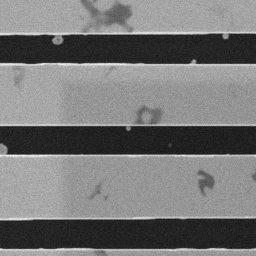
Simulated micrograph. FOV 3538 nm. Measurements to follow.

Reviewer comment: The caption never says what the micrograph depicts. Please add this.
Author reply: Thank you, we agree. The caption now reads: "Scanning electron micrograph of lines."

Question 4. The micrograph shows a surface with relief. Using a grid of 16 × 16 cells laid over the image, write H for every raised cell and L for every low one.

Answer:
HHHHHHHHHHHHHHHH
HHHHHHHHHHHHHHHH
LLLLLLLLLLLLLLLL
LLLLLLLLLLLLLLLL
HHHHHHHHHHHHHHHH
HHHHHHHHHHHHHHHH
HHHHHHHHHHHHHHHH
HHHHHHHHHHHHHHHH
LLLLLLLLLLLLLLLL
LLLLLLLLLLLLLLLL
HHHHHHHHHHHHHHHH
HHHHHHHHHHHHHHHH
HHHHHHHHHHHHHHHH
HHHHHHHHHHHHHHHH
LLLLLLLLLLLLLLLL
LLLLLLLLLLLLLLLL